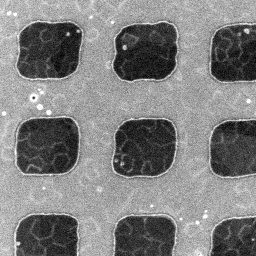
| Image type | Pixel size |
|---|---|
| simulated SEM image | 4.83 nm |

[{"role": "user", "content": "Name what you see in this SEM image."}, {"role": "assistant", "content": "raised bodies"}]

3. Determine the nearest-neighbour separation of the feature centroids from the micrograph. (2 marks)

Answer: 462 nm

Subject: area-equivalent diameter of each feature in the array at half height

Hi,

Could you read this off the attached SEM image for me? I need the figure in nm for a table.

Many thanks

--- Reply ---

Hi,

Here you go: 318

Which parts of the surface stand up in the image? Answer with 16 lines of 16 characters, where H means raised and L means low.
LLLLLLLLLLLLLLLL
LLHHHLLLLHHLLLLH
LHHHHLLHHHHLLHHH
LHHHHLLHHHHLLHHH
LHHHHLLHHHHLLHHH
LLLLLLLLLLLLLLLL
LLLLLLLLLLLLLLLL
LLHHHLLLHHLLLLLH
LHHHHLLHHHHLLHHH
LHHHHLLHHHHLLHHH
LHHHHLLHHHHLLHHH
LLLLLLLLLLLLLLLL
LLLLLLLLLLLLLLLL
LLHHLLLLHHLLLLLL
LHHHHLLHHHHLLHHH
LHHHHLLHHHHLLHHH